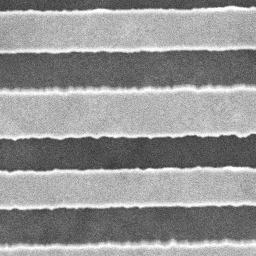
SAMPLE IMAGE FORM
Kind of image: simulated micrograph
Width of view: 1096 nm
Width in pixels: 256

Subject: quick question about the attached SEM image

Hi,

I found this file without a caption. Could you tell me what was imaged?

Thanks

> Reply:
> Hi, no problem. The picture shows lines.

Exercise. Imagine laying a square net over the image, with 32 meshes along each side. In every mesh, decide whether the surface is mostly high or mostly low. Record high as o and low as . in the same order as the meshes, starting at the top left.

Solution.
................................
oooooooooooooooooooooooooooooooo
oooooooooooooooooooooooooooooooo
oooooooooooooooooooooooooooooooo
oooooooooooooooooooooooooooooooo
oooooooooooooooooooooooooooooooo
ooooo.ooo.......................
................................
................................
................................
................................
o..ooooooooooooooooooooooooooooo
oooooooooooooooooooooooooooooooo
oooooooooooooooooooooooooooooooo
oooooooooooooooooooooooooooooooo
oooooooooooooooooooooooooooooooo
oooooooooooooooooooooooooooooooo
................................
................................
................................
................................
o.oooooooooooooooooooooooooooooo
oooooooooooooooooooooooooooooooo
oooooooooooooooooooooooooooooooo
oooooooooooooooooooooooooooooooo
oooooooooooooooooooooooooooooooo
................................
................................
................................
................................
.....................o...ooooooo
oooooooooooooooooooooooooooooooo